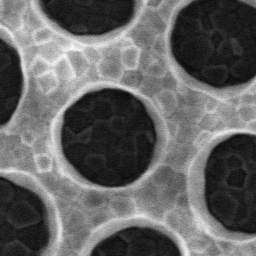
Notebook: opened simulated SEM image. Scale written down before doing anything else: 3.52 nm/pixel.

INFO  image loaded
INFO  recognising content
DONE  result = holes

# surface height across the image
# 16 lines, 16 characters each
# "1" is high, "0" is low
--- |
1110000001100000
1110000011100000
0111100111100000
0111111111100000
0111111111100000
0111111111111001
0111100001111111
0111000000111111
1111000000111100
1111000000111000
1111000001110000
0011110011111000
0001111111111000
0001111111111000
0001111000011100
0001110000011111